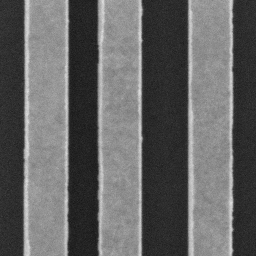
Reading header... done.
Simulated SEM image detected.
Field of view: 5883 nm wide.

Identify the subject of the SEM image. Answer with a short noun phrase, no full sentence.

lines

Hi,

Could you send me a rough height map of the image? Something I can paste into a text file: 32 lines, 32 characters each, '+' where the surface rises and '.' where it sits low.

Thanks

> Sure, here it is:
...+++++.....+++++......+++++...
...+++++.....+++++......+++++...
...+++++.....+++++......+++++...
...+++++.....+++++......+++++...
...+++++.....+++++......+++++...
...+++++.....+++++......+++++...
...+++++.....+++++......+++++...
...+++++.....+++++......+++++...
...+++++.....+++++......+++++...
...+++++.....+++++......+++++...
...+++++.....+++++......+++++...
...+++++.....+++++......+++++...
...+++++.....+++++......+++++...
...+++++.....+++++......+++++...
...+++++.....+++++......+++++...
...+++++.....+++++......+++++...
...+++++.....+++++......+++++...
...+++++.....+++++......+++++...
...+++++.....+++++......+++++...
...+++++.....+++++......+++++...
...+++++.....+++++......+++++...
...+++++.....+++++......+++++...
...+++++.....+++++......+++++...
...+++++.....+++++......+++++...
...+++++.....+++++......+++++...
...+++++.....+++++......+++++...
...+++++.....+++++......+++++...
...+++++.....+++++......+++++...
...+++++.....+++++......+++++...
...+++++.....+++++......+++++...
...+++++.....+++++......+++++...
...+++++.....+++++......+++++...